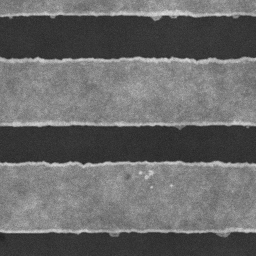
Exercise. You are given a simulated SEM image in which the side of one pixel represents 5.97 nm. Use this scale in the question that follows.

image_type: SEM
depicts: lines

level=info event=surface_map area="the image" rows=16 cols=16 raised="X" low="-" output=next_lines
XXXXXXXXXXXXXXXX
----------------
----------------
----------------
XXXXXXXXXXXXXXXX
XXXXXXXXXXXXXXXX
XXXXXXXXXXXXXXXX
XXXXXXXXXXXXXXXX
----------------
----------------
XXXXXXXXXXXXXXXX
XXXXXXXXXXXXXXXX
XXXXXXXXXXXXXXXX
XXXXXXXXXXXXXXXX
XXXXXXXXXXXXXXXX
----------------